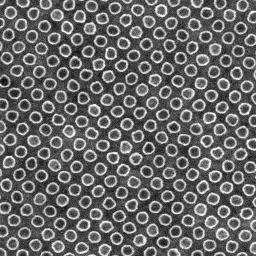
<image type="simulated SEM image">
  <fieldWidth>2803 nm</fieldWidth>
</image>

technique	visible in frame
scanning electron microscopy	a regular array of raised bodies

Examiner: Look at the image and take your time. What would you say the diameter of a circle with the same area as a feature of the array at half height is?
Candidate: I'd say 124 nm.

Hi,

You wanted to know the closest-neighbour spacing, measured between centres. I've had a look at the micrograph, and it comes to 173 nm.